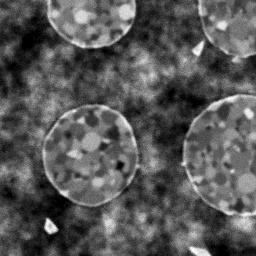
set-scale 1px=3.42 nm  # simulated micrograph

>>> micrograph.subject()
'raised bodies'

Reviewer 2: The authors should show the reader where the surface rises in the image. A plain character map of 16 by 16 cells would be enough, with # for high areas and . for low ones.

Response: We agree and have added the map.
...#####....####
...#####.....###
....###......###
................
................
................
.............###
....####....####
...#####....####
...######..#####
...######...####
...#####....####
....###......###
................
................
................